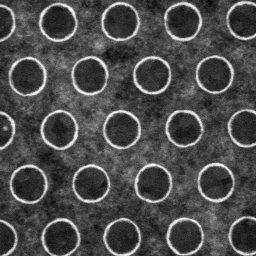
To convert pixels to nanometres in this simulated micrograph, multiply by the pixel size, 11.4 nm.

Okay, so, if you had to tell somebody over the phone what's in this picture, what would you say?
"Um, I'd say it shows a regular array of raised bodies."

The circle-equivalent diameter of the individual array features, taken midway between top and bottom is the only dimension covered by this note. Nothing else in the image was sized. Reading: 0.416 um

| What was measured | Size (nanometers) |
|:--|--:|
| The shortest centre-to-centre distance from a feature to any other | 710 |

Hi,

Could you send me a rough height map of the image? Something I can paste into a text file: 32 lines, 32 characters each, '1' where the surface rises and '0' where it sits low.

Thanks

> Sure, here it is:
00000000000000110000001100000011
10000111100001111000011110000111
11000111100001111000011110001111
11000111100001111000011110000111
10000011100000110000011100000111
00000000000000000000000000000000
00000000000000000000000000000000
00010000001100000011000001110000
00111000011110000111100001111000
01111100011110000111100001111000
01111000011110000111100001111000
00111000001100000011000000100000
00000000000000000000000000000000
00000000000000000000000000000000
10000011100000111000011100000111
11000111100001111000011110000111
11000111110001111000011110000111
10000011100001111000011110000111
00000001000000000000000000000000
00000000000000000000000000000000
00000000000000000000000000000000
00111000001110000111100001111000
01111100011111000111100001111000
01111100011111000111100001111000
00111000001110000111100000110000
00000000000000000000000000000000
00000000000000000000000000000000
00000001000000010000001100000011
10000011100001111000011110000111
11000111110001111000011110000111
11000111110001111000011110000111
10000011100000111000001100000011